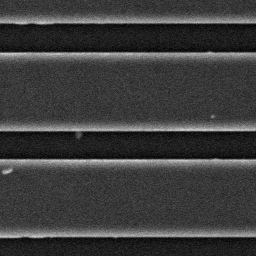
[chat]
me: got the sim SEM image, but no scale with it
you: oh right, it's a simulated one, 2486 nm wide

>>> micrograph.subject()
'lines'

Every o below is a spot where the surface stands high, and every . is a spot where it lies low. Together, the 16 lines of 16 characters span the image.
oooooooooooooooo
................
................
oooooooooooooooo
oooooooooooooooo
oooooooooooooooo
oooooooooooooooo
oooooooooooooooo
................
................
oooooooooooooooo
oooooooooooooooo
oooooooooooooooo
oooooooooooooooo
oooooooooooooooo
................